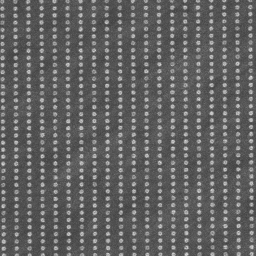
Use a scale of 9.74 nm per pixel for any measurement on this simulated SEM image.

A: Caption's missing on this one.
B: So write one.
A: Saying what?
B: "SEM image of a regular array of raised bodies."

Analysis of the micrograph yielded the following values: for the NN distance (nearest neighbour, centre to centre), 67.3 nm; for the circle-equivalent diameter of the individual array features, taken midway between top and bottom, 34.7 nm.